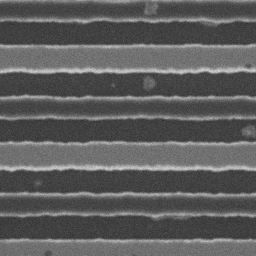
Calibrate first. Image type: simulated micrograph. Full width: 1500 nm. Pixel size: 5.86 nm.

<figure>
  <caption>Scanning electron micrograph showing lines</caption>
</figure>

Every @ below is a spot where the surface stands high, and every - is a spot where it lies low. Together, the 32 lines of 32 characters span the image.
@@@@@@@@@@@@@@@@@@@@@@@@@@@@@@@@
@@@@@@@@@@@@@@@@@@@@@@@@@@@@@@@@
@@@@@@@@@@@@@@@@@@@@@@@@@@@@@@@@
--------------------------------
--------------------------------
--------------------------------
@@@@@@@@@@@@@@@@@@@@@@@@@@@@@@@@
@@@@@@@@@@@@@@@@@@@@@@@@@@@@@@@@
@@@@@@@@@@@@@@@@@@@@@@@@@@@@@@@@
--------------------------------
--------------------------------
--------------------------------
@@@@@@@@@@@@@@@@@@@@@@@@@@@@@@@@
@@@@@@@@@@@@@@@@@@@@@@@@@@@@@@@@
@@@@@@@@@@@@@@@@@@@@@@@@@@@@@@@@
--------------------------------
--------------------------------
--------------------------------
@@@@@@@@@@@@@@@@@@@@@@@@@@@@@@@@
@@@@@@@@@@@@@@@@@@@@@@@@@@@@@@@@
@@@@@@@@@@@@@@@@@@@@@@@@@@@@@@@@
--------------------------------
--------------------------------
--------------------------------
@@@@@@@@@@@@@@@@@@@@@@@@@@@@@@@@
@@@@@@@@@@@@@@@@@@@@@@@@@@@@@@@@
@@@@@@@@@@@@@@@@@@@@@@@@@@@@@@@@
--------------------------------
--------------------------------
--------------------------------
@@@@@@@@@@@@@@@@@@@@@@@@@@@@@@@@
@@@@@@@@@@@@@@@@@@@@@@@@@@@@@@@@